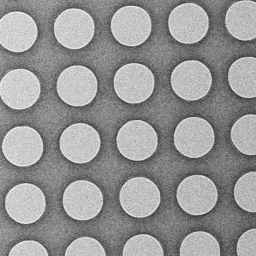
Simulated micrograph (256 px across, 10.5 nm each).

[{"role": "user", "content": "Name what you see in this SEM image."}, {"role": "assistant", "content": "an array of small figures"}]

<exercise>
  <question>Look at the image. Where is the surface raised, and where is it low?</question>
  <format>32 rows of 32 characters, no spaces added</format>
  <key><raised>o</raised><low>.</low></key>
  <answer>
.......................o.....ooo
........ooo....ooo....oooo..oooo
oooo...ooooo..ooooo..ooooo..oooo
ooooo..ooooo..ooooo..ooooo..oooo
ooooo..ooooo..ooooo...ooo....ooo
oooo....ooo....oo...............
................................
..............................oo
.........oo....ooo....oooo...ooo
.ooo....oooo..ooooo..ooooo...ooo
ooooo..ooooo..ooooo..ooooo...ooo
ooooo..ooooo...oooo...oooo...ooo
ooooo...ooo....ooo..............
..o.............................
...............................o
.........o......oo....oooo...ooo
.oooo...oooo...oooo...ooooo..ooo
ooooo...oooo...ooooo..ooooo..ooo
ooooo...oooo...oooo...oooo....oo
.oooo...oooo....ooo....oo.......
..oo............................
................................
................ooo....ooo....oo
..ooo...oooo...ooooo..ooooo..ooo
.oooo...ooooo..ooooo..ooooo..ooo
.ooooo..ooooo..ooooo..ooooo...oo
.oooo...oooo....ooo....ooo......
..ooo...........................
................................
.................oo....ooo....oo
..ooo....ooo....oooo...oooo...oo
.ooooo..ooooo..ooooo...oooo...oo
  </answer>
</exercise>